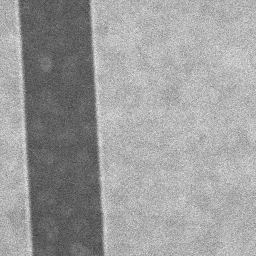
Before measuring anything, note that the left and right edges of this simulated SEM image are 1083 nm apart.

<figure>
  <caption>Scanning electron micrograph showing one or a few lines or trenches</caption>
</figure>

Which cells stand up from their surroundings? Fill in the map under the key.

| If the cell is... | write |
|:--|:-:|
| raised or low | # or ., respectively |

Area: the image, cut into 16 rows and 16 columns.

#.....##########
#.....##########
#.....##########
#.....##########
#.....##########
#.....##########
#.....##########
#.....##########
##....##########
##....##########
##....##########
##....##########
##....##########
##.....#########
##.....#########
##.....#########